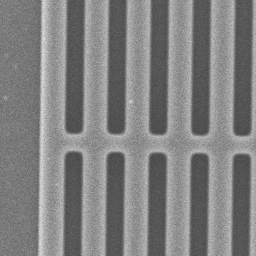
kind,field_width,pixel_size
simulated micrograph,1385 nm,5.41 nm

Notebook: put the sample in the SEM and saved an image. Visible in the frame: groups of lines, slits or small figures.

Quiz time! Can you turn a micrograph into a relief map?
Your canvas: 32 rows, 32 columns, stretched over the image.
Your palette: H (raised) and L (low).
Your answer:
LLLLLHHHLLLHHHLLHHHLLHHHLLHHHLLL
LLLLLHHHLLLHHLLLHHHLLHHHLLHHHLLL
LLLLLHHHLLLHHLLLHHHLLHHHLLHHHLLL
LLLLLHHHLLLHHLLLHHHLLHHHLLHHHLLL
LLLLLHHHLLLHHLLLHHHLLHHHLLHHHLLL
LLLLLHHHLLLHHLLLHHHLLHHHLLHHHLLL
LLLLLHHHLLLHHLLLHHHLLHHHLLHHHLLL
LLLLLHHHLLLHHLLLHHHLLHHHLLHHHLLL
LLLLLHHHLLHHHLLLHHHLLHHHLLHHHLLL
LLLLLHHHLLHHHLLLHHHLLHHHLLHHHLLL
LLLLLHHHLLHHHLLLHHHLLHHHLLHHHLLL
LLLLLHHHLLHHHLLLHHHLLHHHLLHHHLLL
LLLLLHHHLLHHHLLLHHHLLHHHLLHHHLLL
LLLLLHHHLLHHHLLLHHHLLHHHLLHHHLLL
LLLLLHHHLLHHHLLLHHHLLHHHLLHHHLLL
LLLLLHHHLLHHHLLLHHHLLHHHLLHHHLLL
LLLLLHHHLLHHHHLHHHHLLHHHLLHHHLLH
LLLLLHHHHHHHHHHHHHHHHHHHHHHHHHHH
LLLLLHHHHHHHHHHHHHHHHHHHHHHHHHHH
LLLLLHHHLLHHHLLHHHHLLHHHLLHHHLLH
LLLLLHHHLLHHHLLLHHHLLHHHLLHHHLLH
LLLLLHHHLLHHHLLLHHHLLHHHLLHHHLLH
LLLLLHHHLLHHHLLLHHHLLHHHLLHHHLLH
LLLLLHHHLLHHHLLLHHLLLHHHLLHHHLLH
LLLLLHHHLLHHHLLLHHLLLHHHLLHHHLLH
LLLLLHHHLLHHHLLLHHLLLHHHLLHHHLLH
LLLLLHHHLLHHHLLLHHLLLHHHLLHHHLLH
LLLLLHHHLLHHHLLLHHLLLHHHLLHHHLLH
LLLLLHHHLLHHHLLLHHLLLHHHLLHHHLLH
LLLLLHHHLLHHHLLLHHLLLHHHLLHHHLLH
LLLLLHHHLLHHHLLHHHLLLHHHLLHHHLLH
LLLLLHHHLLHHHLLHHHLLLHHHLLHHHLLH